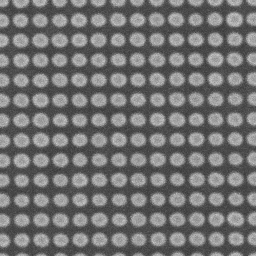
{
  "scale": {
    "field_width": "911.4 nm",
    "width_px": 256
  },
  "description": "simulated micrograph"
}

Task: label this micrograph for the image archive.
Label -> a regular array of raised bodies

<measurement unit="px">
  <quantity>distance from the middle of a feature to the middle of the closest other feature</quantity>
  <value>19.3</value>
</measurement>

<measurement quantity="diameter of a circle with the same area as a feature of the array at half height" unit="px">13.2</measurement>